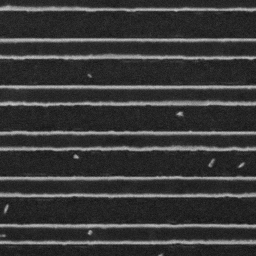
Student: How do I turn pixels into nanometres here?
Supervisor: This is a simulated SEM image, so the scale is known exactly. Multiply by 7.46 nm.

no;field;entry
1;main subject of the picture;lines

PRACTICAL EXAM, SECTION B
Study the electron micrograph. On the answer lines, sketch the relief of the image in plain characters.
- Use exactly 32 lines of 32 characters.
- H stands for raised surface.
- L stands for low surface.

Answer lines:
HHHHHHHHHHHHHHHHHHHHHHHHHHHHHHHH
LLLLLLLLLLLLLLLLLLLLLLLLLLLLLLLL
LLLLLLLLLLLLLLLLLLLLLLLLLLLLLLLL
LLLLLLLLLLLLLLLLLLLLLLLLLLLLLLLL
LLLLLLLLLLLLLLLLLLLLLLLLLLLLLLLL
HHHHHHHHHHHHHHHHHHHHHHHHHHHHHHHH
HHHHHHHHHHHHHHHHHHHHHHHHHHHHHHHH
LLLLLLLLLLLLLLLLLLLLLLLLLLLLLLLL
LLLLLLLLLLLLLLLLLLLLLLLLLLLLLLLL
LLLLLLLLLLLLLLLLLLLLLLLLLLLLLLLL
LLLLLLLLLLLLLLLLLLLLLLLLLLLLLLLL
HHHHHHHHHHHHHHHHHHHHHHHHHHHHHHHH
HHHHHHHHHHHHHHHHHHHHHHHHHHHHHHHH
LLLLLLLLLLLLLLLLLLLLLLLLLLLLLLLL
LLLLLLLLLLLLLLLLLLLLLLLLLLLLLLLL
LLLLLLLLLLLLLLLLLLLLLLLLLLLLLLLL
LLLLLLLLLLLLLLLLLLLLLLLLLLLLLLLL
HHHHHHHHHHHHHHHHHHHHHHHHHHHHHHHH
HHHHHHHHHHHHHHHHHHHHHHHHHHHHHHHH
LLLLLLLLLLLLLLLLLLLLLLLLLLLLLLLL
LLLLLLLLLLLLLLLLLLLLLLLLLLLLLLLL
LLLLLLLLLLLLLLLLLLLLLLLLLLLLLLLL
HHHHHHHHHHHHHHHHHHHHHHHHHHHHHHHH
HHHHHHHHHHHHHHHHHHHHHHHHHHHHHHHH
LLLHLLLLLLLLLHHLLLLLLHLHLLHHLHHL
LLLLLLLLLLLLLLLLLLLLLLLLLLLLLLLL
LLLLLLLLLLLLLLLLLLLLLLLLLLLLLLLL
LLLLLLLLLLLLLLLLLLLLLLLLLLLLLLLL
HHHHHHHHHHHHHHHHHHHHHHHHHHHHHHHH
HHHHHHHHHHHHHHHHHHHHHHHHHHHHHHHH
LLLLLLLLLLLLLLLLLLLLLLLLLLLLLLLL
LLLLLLLLLLLLLLLLLLLLLLLLLLLLLLLL